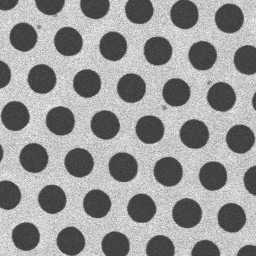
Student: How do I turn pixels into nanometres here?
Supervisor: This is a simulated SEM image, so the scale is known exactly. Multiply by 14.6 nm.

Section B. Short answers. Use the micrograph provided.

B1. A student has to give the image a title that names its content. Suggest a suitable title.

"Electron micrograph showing a regular array of holes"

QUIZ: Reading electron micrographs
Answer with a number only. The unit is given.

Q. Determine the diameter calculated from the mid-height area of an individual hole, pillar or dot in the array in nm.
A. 423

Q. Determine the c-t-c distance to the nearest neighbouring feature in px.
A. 44.9